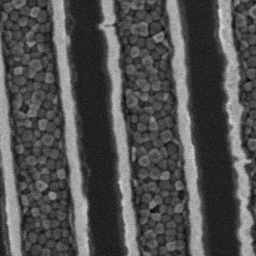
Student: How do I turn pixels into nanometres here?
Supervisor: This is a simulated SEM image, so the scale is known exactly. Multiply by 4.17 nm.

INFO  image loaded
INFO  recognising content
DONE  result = one or a few lines or trenches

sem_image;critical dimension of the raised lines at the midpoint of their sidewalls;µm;0.209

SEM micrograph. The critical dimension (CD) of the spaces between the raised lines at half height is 270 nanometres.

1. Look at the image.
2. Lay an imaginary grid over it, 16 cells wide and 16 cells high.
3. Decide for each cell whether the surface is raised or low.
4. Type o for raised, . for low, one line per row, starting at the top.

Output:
....ooo....ooo..
....ooo....ooo..
....ooo....ooo..
....ooo....ooo..
....ooo....oooo.
....ooo....oooo.
....ooo....oooo.
....ooo....oooo.
....oooo....ooo.
....oooo....ooo.
o....ooo....ooo.
o....ooo....ooo.
o....ooo....ooo.
o....ooo....ooo.
o....ooo....ooo.
o....ooo....ooo.